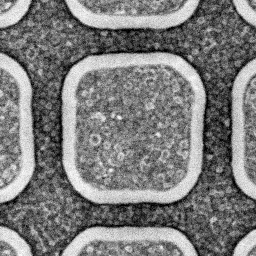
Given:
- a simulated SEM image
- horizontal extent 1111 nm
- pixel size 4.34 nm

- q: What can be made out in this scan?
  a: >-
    raised bodies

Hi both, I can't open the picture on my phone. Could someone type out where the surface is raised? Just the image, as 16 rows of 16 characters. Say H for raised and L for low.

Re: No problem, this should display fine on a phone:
HLLLLHHHHHHHLLLH
LLLLLLLLLLLLLLLL
LLLLLLLLLLLLLLLL
LLLLLLLLLLLLLLLL
HLLLLHHHHHHHLLLL
HHLLHHHHHHHHLLLH
HHLLHHHHHHHHHLLH
HHLLHHHHHHHHLLLH
HHLLHHHHHHHHLLLH
HHLLHHHHHHHHLLLH
HHLLHHHHHHHHLLLH
HLLLLHHHHHHHLLLH
LLLLLLLLLLLLLLLL
LLLLLLLLLLLLLLLL
LLLLLLLLLLLLLLLL
HLLLLHHHHHHHLLLH